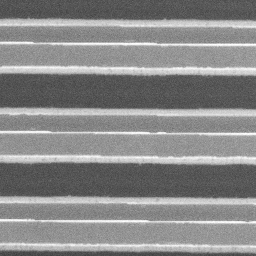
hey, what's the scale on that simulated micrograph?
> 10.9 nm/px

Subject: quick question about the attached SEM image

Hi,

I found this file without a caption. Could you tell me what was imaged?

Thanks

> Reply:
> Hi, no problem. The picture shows lines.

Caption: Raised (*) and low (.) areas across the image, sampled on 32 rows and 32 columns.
................................
................................
................................
********************************
********************************
********************************
********************************
********************************
*..*****************************
................................
................................
................................
................................
................................
********************************
********************************
********************************
********************************
********************************
********************************
................................
................................
................................
................................
................................
********************************
********************************
********************************
********************************
********************************
********************************
................................